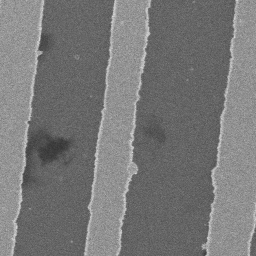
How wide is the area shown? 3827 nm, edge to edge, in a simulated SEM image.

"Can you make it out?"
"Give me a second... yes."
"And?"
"one or a few lines or trenches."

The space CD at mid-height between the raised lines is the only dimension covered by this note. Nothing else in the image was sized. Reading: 1.14 microns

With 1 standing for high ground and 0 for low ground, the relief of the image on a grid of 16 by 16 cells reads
1110000110000001
1110000110000001
1100000110000001
1100000110000011
1100000110000011
1100000110000011
1100000110000011
1100001100000011
1100001100000011
1100001100000011
1000001100000111
1000001100000111
1000001100000111
1000001100000111
1000001100000111
1000011000000111